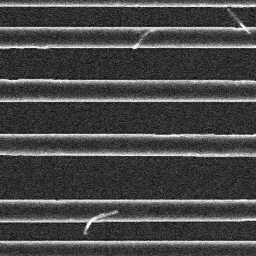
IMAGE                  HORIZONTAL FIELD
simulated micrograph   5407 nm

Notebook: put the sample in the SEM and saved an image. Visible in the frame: lines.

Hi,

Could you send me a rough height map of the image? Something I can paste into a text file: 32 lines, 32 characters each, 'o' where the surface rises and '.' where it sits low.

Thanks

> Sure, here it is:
oooooooooooooooooooooooooooooooo
................................
................................
ooooooooooooooooooooooooooooo.oo
oooooooooooooooooooooooooooooooo
oooooooooooooooooooooooooooooooo
................................
................................
................................
................................
oooooooooooooooooooooooooooooooo
oooooooooooooooooooooooooooooooo
oooooooooooooooooooooooooooooooo
................................
................................
................................
................................
oooooooooooooooooooooooooooooooo
oooooooooooooooooooooooooooooooo
................................
................................
................................
................................
................................
................................
oooooooooooooooooooooooooooooooo
oooooooooooooooooooooooooooooooo
oooooooooooooooooooooooooo......
................................
................................
oooooooooooooooooooooooooooooooo
oooooooooooooooooooooooooooooooo